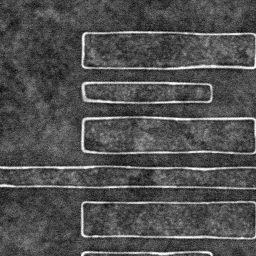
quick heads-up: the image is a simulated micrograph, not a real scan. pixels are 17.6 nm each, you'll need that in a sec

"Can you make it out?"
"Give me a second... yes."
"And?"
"groups of lines, slits or small figures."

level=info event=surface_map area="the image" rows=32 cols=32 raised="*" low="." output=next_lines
................................
................................
................................
................................
...........*********************
..........**********************
..........**********************
..........**********************
.............**********.........
................................
...........***************......
..........****************......
...........***************......
................................
................................
..........**********************
..........**********************
..........**********************
..........**********************
................................
................................
********************************
********************************
..............................**
................................
...........*********************
..........**********************
..........**********************
..........**********************
...........*********************
................................
................................